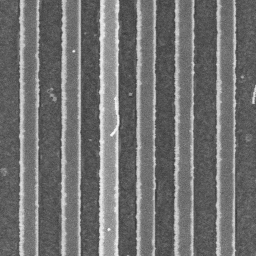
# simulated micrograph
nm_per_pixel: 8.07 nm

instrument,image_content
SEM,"lines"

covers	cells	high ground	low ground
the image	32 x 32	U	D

DDDUUDDDUUDDDUUDDUUDDDUUDDDUUDDD
DDDUUDDDUUDDDUUDDUUDDDUUDDDUUDDD
DDDUUDDDUUDDDUUDDUUDDDUUDDDUUDDD
DDDUUDDDUUDDDUUDDUUDDDUUDDDUUDDD
DDDUUDDDUUDDDUUDDUUDDDUUDDDUUDDD
DDDUUDDDUUDDDUUDDUUDDDUUDDDUUDDD
DDDUUDDDUUDDDUUDDUUDDDUUDDDUUDDD
DDDUUDDDUUDDDUUDDUUDDDUUDDDUUDDD
DDDUUDDDUUDDDUUDDUUDDDUUDDDUUDDD
DDDUUDDDUUDDDUUDDUUDDDUUDDDUUDDD
DDDUUDDDUUDDDUUDDUUDDDUUDDDUUDDD
DDDUUDDDUUDDDUUDDUUDDDUUDDDUUDDD
DDDUUDDDUUDDDUUDDUUDDDUUDDDUUDDD
DDDUUDDDUUDDDUUDDUUDDDUUDDDUUDDD
DDDUUDDDUUDDDUUDDUUDDDUUDDDUUDDD
DDDUUDDDUUDDDUUDDUUDDDUUDDDUUDDD
DDDUUDDDUUDDDUUDDUUDDDUUDDDUUDDD
DDUUUDDDUUDDDUUDDUUDDDUUDDDUUDDD
DDDUUDDDUUDDDUUDDUUDDDUUDDDUUDDD
DDDUUDDDUUDDDUUDDUUDDDUUDDDUUDDD
DDDUUDDDUUDDDUUDDUUDDDUUDDDUUDDD
DDDUUDDDUUDDDUUDDUUDDDUUDDDUUDDD
DDDUUDDDUUDDDUUDDUUDDDUUDDDUUDDD
DDDUUDDDUUDDDUUDDUUDDDUUDDDUUDDD
DDDUUDDDUUDDDUUDDUUDDDUUDDDUUDDD
DDDUUDDDUUDDDUUDDUUDDDUUDDDUUDDD
DDDUUDDDUUDDDUUDDUUDDDUUDDDUUDDD
DDDUUDDDUUDDDUUDDUUDDDUUDDDUUDDD
DDDUUDDDUUDDUUUDDUUDDDUUDDDUUDDD
DDDUUDDDUUDDDUUDDUUDDDUUDDDUUDDD
DDDUUDDDUUDDUUUDDUUDDDUUDDDUUDDD
DDDUUDDDUUDDDUUDDUUDDDUUDDDUUDDD